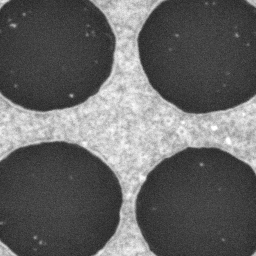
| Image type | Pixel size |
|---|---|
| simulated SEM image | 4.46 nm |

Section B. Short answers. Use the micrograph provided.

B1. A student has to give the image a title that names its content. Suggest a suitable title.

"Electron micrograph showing holes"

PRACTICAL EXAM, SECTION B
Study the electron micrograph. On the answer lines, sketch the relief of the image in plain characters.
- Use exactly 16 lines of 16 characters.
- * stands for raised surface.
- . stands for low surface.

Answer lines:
......****......
.......**.......
.......**.......
.......**.......
.......**.......
......****......
*....******....*
****************
****************
*.....*****...**
.......***......
........*.......
................
................
.......**.......
......***.......